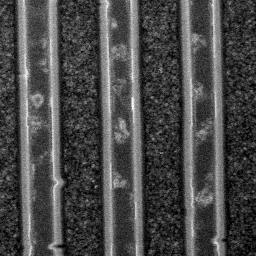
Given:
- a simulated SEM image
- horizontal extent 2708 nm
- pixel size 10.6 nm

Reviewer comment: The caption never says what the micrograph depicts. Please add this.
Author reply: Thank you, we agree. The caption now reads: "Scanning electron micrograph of one or a few lines or trenches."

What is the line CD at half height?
333 nanometres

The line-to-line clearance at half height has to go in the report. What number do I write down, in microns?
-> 0.535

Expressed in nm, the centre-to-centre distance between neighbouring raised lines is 864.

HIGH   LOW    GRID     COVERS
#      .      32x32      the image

...####......####......####.....
...####......####......####.....
...####......####......####.....
...####......####......####.....
...####......####......####.....
...####......####......####.....
...####......####......####.....
...####......####......####.....
...####......####......####.....
...####......####......####.....
...####......####......####.....
...####......####.......###.....
...####......####.......###.....
...####......####......####.....
...####......####......####.....
...####......####.......###.....
...####......####.......###.....
...####......####.......###.....
...####......####......####.....
...####......####......####.....
...####......####......####.....
...####......####.......###.....
...####......####.......###.....
...####......####.......####....
...####......####.......####....
...####......####.......###.....
...####......####.......###.....
...####......####.......###.....
...####.......###.......####....
...####.......###.......####....
...####.......###.......####....
...####.......###.......####....